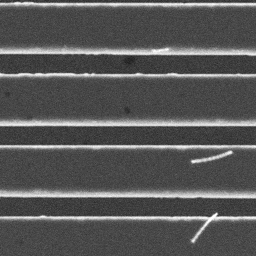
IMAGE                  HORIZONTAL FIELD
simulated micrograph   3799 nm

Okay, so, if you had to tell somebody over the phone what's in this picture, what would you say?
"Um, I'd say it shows lines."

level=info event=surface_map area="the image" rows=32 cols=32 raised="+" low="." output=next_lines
++++++++++++++++++++++++++++++++
++++++++++++++++++++++++++++++++
++++++++++++++++++++++++++++++++
++++++++++++++++++++++++++++++++
++++++++++++++++++++++++++++++++
++++++++++++++++++++++++++++++++
++++++++++++++++++++++++++++++++
................................
................................
++++++++++++++++++++++++++++++++
++++++++++++++++++++++++++++++++
++++++++++++++++++++++++++++++++
++++++++++++++++++++++++++++++++
++++++++++++++++++++++++++++++++
++++++++++++++++++++++++++++++++
++++++...+++++++.++++++++.++++++
................................
................................
++++++++++++++++++++++++++++++++
++++++++++++++++++++++++++++++++
++++++++++++++++++++++++++++++++
++++++++++++++++++++++++++++++++
++++++++++++++++++++++++++++++++
++++++++++++++++++++++++++++++++
..............................++
................................
................................
++++++++++++++++++++++++++++++++
++++++++++++++++++++++++++++++++
++++++++++++++++++++++++++++++++
++++++++++++++++++++++++++++++++
++++++++++++++++++++++++++++++++